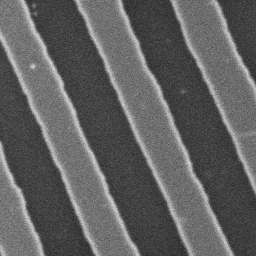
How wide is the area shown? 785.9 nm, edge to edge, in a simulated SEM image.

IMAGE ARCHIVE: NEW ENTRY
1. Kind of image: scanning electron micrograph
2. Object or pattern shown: lines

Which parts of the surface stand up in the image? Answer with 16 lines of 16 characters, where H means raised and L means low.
HHLLLHHHLLLHHHLL
HHLLLHHHLLLHHHLL
HHHLLLHHHLLLHHHL
LHHLLLHHHLLLHHHL
LHHHLLLHHLLLLHHH
LHHHLLLHHHLLLHHH
LLHHLLLLHHLLLLHH
LLHHHLLLHHHLLLHH
LLLHHLLLHHHLLLHH
LLLHHHLLLHHHLLLH
HLLLHHLLLHHHLLLH
HLLLHHHLLLHHHLLL
HLLLHHHLLLHHHLLL
HHLLLHHLLLLHHLLL
HHLLLHHHLLLHHHLL
HHHLLLHHLLLLHHLL